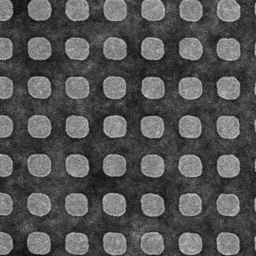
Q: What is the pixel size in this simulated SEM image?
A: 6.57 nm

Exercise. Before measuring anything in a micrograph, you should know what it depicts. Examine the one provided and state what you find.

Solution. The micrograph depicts a regular array of raised bodies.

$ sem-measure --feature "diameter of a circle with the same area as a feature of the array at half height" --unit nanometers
154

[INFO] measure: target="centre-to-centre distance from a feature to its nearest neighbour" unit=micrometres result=0.248